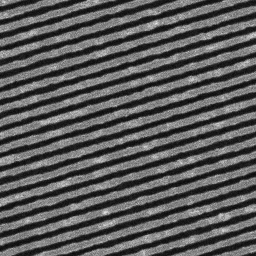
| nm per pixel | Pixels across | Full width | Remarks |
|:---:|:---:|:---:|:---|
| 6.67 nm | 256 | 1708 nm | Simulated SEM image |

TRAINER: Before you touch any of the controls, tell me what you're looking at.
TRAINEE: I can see parallel lines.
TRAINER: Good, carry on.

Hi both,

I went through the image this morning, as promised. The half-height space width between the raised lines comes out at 0.036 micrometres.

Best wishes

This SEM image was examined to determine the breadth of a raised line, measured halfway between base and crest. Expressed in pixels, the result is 7.2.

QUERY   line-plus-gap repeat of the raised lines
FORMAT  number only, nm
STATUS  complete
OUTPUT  85.1